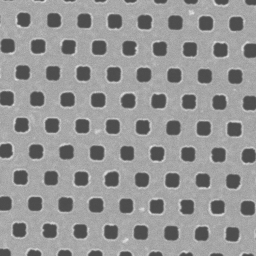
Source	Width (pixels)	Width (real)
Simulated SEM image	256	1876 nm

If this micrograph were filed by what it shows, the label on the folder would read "a regular array of holes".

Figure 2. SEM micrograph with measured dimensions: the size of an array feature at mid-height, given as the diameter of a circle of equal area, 15.1 pixels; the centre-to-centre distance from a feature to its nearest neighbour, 220 nm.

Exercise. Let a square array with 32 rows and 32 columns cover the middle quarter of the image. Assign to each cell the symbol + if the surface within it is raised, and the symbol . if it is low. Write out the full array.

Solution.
++++++++++++++++++++++++++++++++
+++...+++++...++++....++++...+++
+++....++++...++++....++++...+++
+++...+++++...++++....++++...+++
+++++++++++++++++++..++++++..+++
++++++++++++++++++++++++++++++++
++++++++++++++++++++++++++++++++
..+++++...+++++..+++++++++++++++
...++++...++++....++++....+++...
...++++...++++....++++....+++...
..+++++...++++....++++...+++++..
++++++++++++++++++++++++++++++++
++++++++++++++++++++++++++++++++
++++++++++++++++++++++++++++++++
+++...+++++...++++...+++++...+++
+++...++++....++++...+++++...+++
+++...++++....++++...++++....+++
++++++++++++++++++...+++++...+++
++++++++++++++++++++++++++++++++
++++++++++++++++++++++++++++++++
..+++++..++++++..+++++++++++++++
..+++++...++++....++++...++++...
..+++++...++++....++++...++++...
..+++++...++++...+++++...++++...
++++++++++++++++++++++++++++++++
++++++++++++++++++++++++++++++++
++++++++++++++++++++++++++++++++
+++...+++++..+++++...+++++..++++
+++...++++....++++...++++....+++
++....++++....++++...++++....+++
+++..++++++..+++++...+++++...+++
++++++++++++++++++++++++++++++++